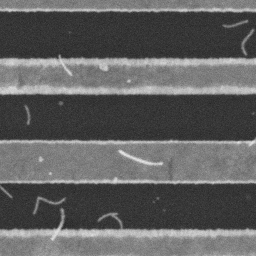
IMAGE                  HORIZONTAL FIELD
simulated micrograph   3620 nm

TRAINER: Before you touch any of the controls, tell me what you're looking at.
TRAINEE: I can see lines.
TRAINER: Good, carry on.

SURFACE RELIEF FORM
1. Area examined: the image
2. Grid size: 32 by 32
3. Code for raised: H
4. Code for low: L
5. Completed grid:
HHHHHHHHHHHHHHHHHHHHHHHHHHHHHHHH
LLLLLLLLLLLLLLLLLLLLLLLLLLLLLLLL
LLLLLLLLLLLLLLLLLLLLLLLLLLLLLLLL
LLLLLLLLLLLLLLLLLLLLLLLLLLLLLLLL
LLLLLLLLLLLLLLLLLLLLLLLLLLLLLLLL
LLLLLLLLLLLLLLLLLLLLLLLLLLLLLLLL
LLLLLLLLLLLLLLLLLLLLLLLLLLLLLLLL
HHHHHHHHHHHHHHHHLHHHHHHHHHHHHHHH
HHHHHHHHHHHHHHHHHHHHHHHHHHHHHHHH
HHHHHHHHHHHHHHHHHHHHHHHHHHHHHHHH
HHHHHHHHHHHHHHHHHHHHHHHHHHHHHHHH
HHHHHHHHHHHHHHHHHHHHHHHHHHHHHHHH
LLLLLLLLLLLLLLLLLLLLLLLLLLLLLLLL
LLLLLLLLLLLLLLLLLLLLLLLLLLLLLLLL
LLLLLLLLLLLLLLLLLLLLLLLLLLLLLLLL
LLLLLLLLLLLLLLLLLLLLLLLLLLLLLLLL
LLLLLLLLLLLLLLLLLLLLLLLLLLLLLLLL
LLLLLLLLLLLLLLLLLLLLLLLLLLLLLLLL
HHHHHHHHHHHHHHHHHHHHHHHHHHHHHHHH
HHHHHHHHHHHHHHHHHHHHHHHHHHHHHHHH
HHHHHHHHHHHHHHHHHHHHHHHHHHHHHHHH
HHHHHHHHHHHHHHHHHHHHHHHHHHHHHHHH
HHHHHHHHHHHHHHHHHHHHHHHHHHHHHHHH
LLLLLLLLLLLLLLLLLLLLLLLLLLLLLLLL
LLLLLLLLLLLLLLLLLLLLLLLLLLLLLLLL
LLLLLLLLLLLLLLLLLLLLLLLLLLLLLLLL
LLLLLLLLLLLLLLLLLLLLLLLLLLLLLLLL
LLLLLLLLLLLLLLLLLLLLLLLLLLLLLLLL
LLLLLLLLLLLLLLLLLLLLLLLLLLLLLLLL
HHHHHHHHHHHHHHHHHHHHHHHHHHHHHHHH
HHHHHHHHHHHHHHHHHHHHHHHHHHHHHHHH
HHHHHHHHHHHHHHHHHHHHHHHHHHHHHHHH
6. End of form